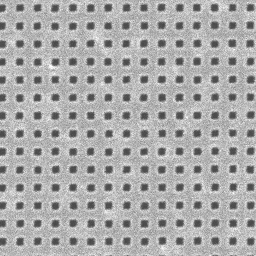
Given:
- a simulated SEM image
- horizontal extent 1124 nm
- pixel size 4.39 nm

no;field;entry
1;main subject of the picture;a regular array of holes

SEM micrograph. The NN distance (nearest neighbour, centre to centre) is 76.9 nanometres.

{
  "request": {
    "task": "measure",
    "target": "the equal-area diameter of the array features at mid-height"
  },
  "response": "37.4 nanometres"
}